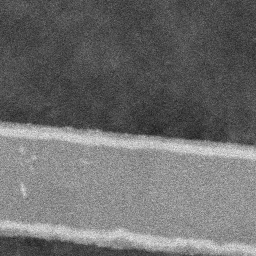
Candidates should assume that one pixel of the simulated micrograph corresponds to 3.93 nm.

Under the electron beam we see one or a few lines or trenches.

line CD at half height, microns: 0.369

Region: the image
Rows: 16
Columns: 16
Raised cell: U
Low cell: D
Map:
DDDDDDDDDDDDDDDD
DDDDDDDDDDDDDDDD
DDDDDDDDDDDDDDDD
DDDDDDDDDDDDDDDD
DDDDDDDDDDDDDDDD
DDDDDDDDDDDDDDDD
DDDDDDDDDDDDDDDD
DDDDDDDDDDDDDDDD
UUUUDDDDDDDDDDDD
UUUUUUUUUUUUUUDD
UUUUUUUUUUUUUUUU
UUUUUUUUUUUUUUUU
UUUUUUUUUUUUUUUU
UUUUUUUUUUUUUUUU
DDDDUUUUUUUUUUUU
DDDDDDDDDDDDDDDU